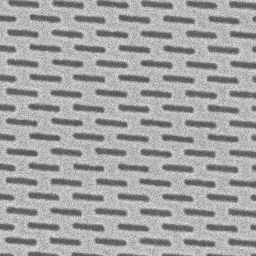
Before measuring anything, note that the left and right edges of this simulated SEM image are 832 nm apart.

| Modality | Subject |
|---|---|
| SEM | a regular array of holes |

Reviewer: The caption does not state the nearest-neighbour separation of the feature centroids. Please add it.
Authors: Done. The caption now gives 85.6 nanometers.